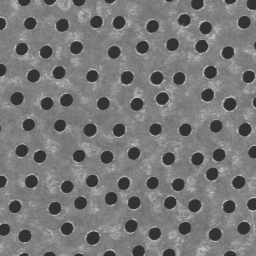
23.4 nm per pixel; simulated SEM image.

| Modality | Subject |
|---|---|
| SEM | a regular array of holes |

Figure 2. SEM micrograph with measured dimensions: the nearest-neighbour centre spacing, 587 nanometres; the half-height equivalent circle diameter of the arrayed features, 0.302 micrometres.